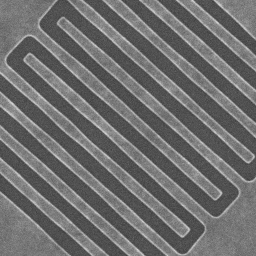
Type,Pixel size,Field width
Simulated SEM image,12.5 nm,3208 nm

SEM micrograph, groups of lines, slits or small figures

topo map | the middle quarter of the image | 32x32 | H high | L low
HHHHHLLLLHHHHHLLLLLHHHHLLLLLHHHH
LHHHHHLLLLLHHHHLLLLLHHHHLLLLLHHH
LLHHHHHLLLLLHHHHLLLLLHHHHLLLLLHH
LLLLHHHHLLLLLHHHHLLLLLHHHHLLLLLH
LLLLHHHHHLLLLLHHHHLLLLLHHHHLLLLL
HLLLLLHHHHLLLLLHHHHLLLLLHHHHLLLL
HHLLLLLHHHHLLLLLHHHHLLLLLLHHHHLL
HHHLLLLLHHHHLLLLLHHHHLLLLLLHHHHL
HHHHLLLLLHHHHHLLLLHHHHHLLLLLHHHH
LHHHHHLLLLHHHHHLLLLHHHHHLLLLLHHH
LLHHHHHLLLLHHHHHLLLLLHHHHLLLLLHH
LLLHHHHHLLLLLHHHHLLLLLHHHHLLLLLH
LLLLHHHHHLLLLLHHHHLLLLLHHHHLLLLL
HLLLLLHHHHLLLLLHHHHLLLLLHHHHLLLL
HHLLLLLHHHHLLLLLHHHHLLLLLHHHHLLL
HHHLLLLLHHHHLLLLLHHHHLLLLLHHHHLL
HHHHLLLLLHHHHLLLLLHHHHLLLLLLHHHL
LHHHHLLLLLHHHHLLLLLHHHHLLLLLLHHH
LLHHHHLLLLLHHHHLLLLLHHHHLLLLLLHH
LLLHHHHLLLLLHHHHLLLLLLHHHLLLLLLH
LLLLLHHHLLLLLLHHHHLLLLLHHHLLLLLL
LLLLLLHHHLLLLLLHHHHLLLLLHHHHLLLL
HLLLLLLHHHLLLLLHHHHHLLLLLHHHHLLL
HHLLLLLLHHHLLLLLLHHHHLLLLLHHHHLL
HHHLLLLLLHHHHLLLLLHHHHLLLLLHHHHL
LHHHLLLLLLHHHHLLLLLHHHHLLLLLHHHH
LLHHHLLLLLLHHHHLLLLLHHHHLLLLLHHH
LLLHHHHLLLLLHHHHLLLLLHHHHLLLLLHH
LLLLHHHHLLLLLHHHHLLLLLHHHHLLLLLH
LLLLLHHHHLLLLLHHHHLLLLLHHHHHLLLL
HLLLLLHHHHLLLLLHHHHLLLLLHHHHHLLL
HHLLLLLLHHHLLLLLHHHHHLLLLHHHHHLL